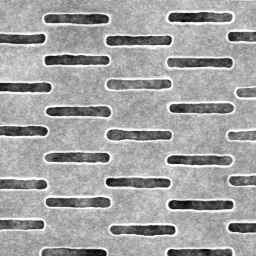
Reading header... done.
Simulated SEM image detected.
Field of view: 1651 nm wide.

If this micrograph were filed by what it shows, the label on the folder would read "a regular array of holes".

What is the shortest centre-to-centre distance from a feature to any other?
291 nm